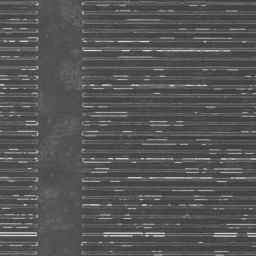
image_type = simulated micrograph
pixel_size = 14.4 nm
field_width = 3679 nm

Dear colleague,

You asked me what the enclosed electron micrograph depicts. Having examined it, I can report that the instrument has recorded parallel lines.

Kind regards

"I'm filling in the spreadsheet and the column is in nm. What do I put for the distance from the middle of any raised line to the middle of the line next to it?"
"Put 133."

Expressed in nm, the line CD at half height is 39.5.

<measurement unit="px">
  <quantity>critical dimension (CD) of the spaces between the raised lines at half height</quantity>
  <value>6.37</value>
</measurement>